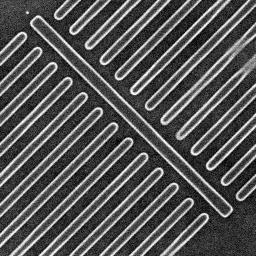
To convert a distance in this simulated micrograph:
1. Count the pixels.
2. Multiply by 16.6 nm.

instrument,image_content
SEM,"groups of lines, slits or small figures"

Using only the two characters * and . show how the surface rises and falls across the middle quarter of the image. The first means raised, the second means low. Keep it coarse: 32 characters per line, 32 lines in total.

..*****........***....***.....**
...*****.....****....***.....***
....*****....***....***.....***.
.....*****...**....***.....***..
**....*****.......***.....***...
*......*****.....***.....***....
*.......*****....**.....***.....
....**...****....*.....***....**
...***....****........***....***
..***......*****.....***....***.
.***........*****...***....***..
***....***...*****........****..
**.....***....*****......***....
*....****......*****....***.....
....****........*****...**.....*
....***....**....*****........**
..****....***.....*****......***
.****....***.......*****....***.
****....***.....*...****....**..
***....***.....**....****.......
**....***.....***.....*****.....
*....***.....***.......*****....
....***.....***....**...*****...
...***.....***....***....*****..
..***.....***....***......*****.
.***.....***....***........*****
***.....***....****....*....****
**.....***....***.....***....***
*.....***....***.....***......**
.....***....****....***........*
....***....***.....***....**....
...***....***.....***....***....